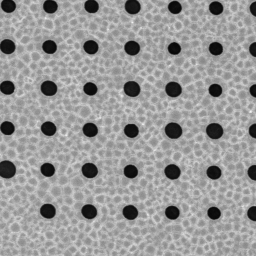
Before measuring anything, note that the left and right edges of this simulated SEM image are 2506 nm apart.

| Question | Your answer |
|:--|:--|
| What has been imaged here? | a regular array of holes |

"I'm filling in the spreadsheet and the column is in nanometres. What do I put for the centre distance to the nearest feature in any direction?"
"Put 398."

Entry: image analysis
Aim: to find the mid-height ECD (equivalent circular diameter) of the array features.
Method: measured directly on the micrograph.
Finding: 144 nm